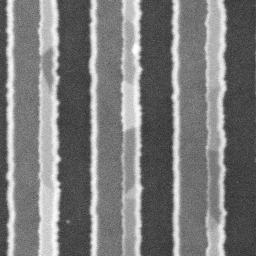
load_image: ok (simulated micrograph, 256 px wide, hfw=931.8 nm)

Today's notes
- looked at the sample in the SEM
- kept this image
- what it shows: lines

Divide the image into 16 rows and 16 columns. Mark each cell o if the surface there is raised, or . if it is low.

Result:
.oo...ooo..ooo..
.oo...ooo..ooo..
.oo...ooo..ooo..
.oo...ooo..ooo..
.oo...ooo..ooo..
.oo...ooo..ooo..
.oo...ooo..ooo..
.oo...ooo..ooo..
.oo...ooo..ooo..
.oo...ooo..ooo..
.oo...ooo..ooo..
.oo...ooo..ooo..
.ooo..ooo..ooo..
.ooo..ooo..ooo..
.oo...ooo..ooo..
.oo...ooo..ooo..